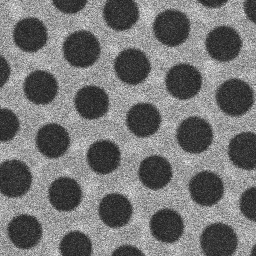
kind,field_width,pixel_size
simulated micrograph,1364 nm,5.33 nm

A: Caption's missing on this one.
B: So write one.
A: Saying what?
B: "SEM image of a regular array of holes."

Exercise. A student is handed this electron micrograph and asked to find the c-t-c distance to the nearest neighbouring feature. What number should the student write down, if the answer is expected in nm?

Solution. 285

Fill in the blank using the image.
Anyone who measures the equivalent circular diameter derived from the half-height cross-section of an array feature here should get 187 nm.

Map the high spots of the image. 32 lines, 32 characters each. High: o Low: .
ooooooo....oo....oooooooo...ooo.
oooooooo..ooo....ooo...oooooooo.
ooo..oooooooo....oo.....ooooooo.
oo....oooooooo..ooo.....ooo..ooo
oo....ooo...ooooooo.....oo....oo
oo....oo....oooooooo...ooo....oo
oooooooo.....oo...oooooooo....oo
.ooooooo....oo.....oooooooo..ooo
.ooooooooooooo.....oo...oooooooo
.ooo...oooooooo...ooo....ooooooo
.oo....ooooooooo.oooo....ooo...o
ooo....ooo...oooooooo....oo.....
oooo...oo.....ooooooooooooo.....
ooooooooo.....oo...oooooooo....o
..oooooooo...ooo....ooooooooo.oo
..oooo.ooooooooo....oo....oooooo
..ooo...oooooooo...ooo.....ooooo
.ooo.....ooooooooooooo.....oo...
ooooo....oo....oooooooo...oo....
oooooo..ooo....oooo.ooooooooo...
...oooooooo....ooo...oooooooo...
....oooooooo..ooo....oooo.oooooo
....ooo..oooooooo....ooo....oooo
....oo....ooooooooo.oooo....ooo.
o..ooo....ooo...oooooooo....oo..
oooooo....oo....ooooooooo..ooo..
oooooooooooo.....ooo..oooooooo..
o....oooooooo...ooo....oooooooo.
o....oooooooooooooo....ooo...ooo
o....ooo...oooooooo....oo.....oo
oo...oo....oooooooooooooo.....oo
ooooooo....ooo....ooooooo....oo.